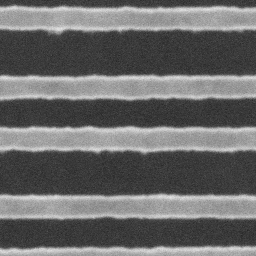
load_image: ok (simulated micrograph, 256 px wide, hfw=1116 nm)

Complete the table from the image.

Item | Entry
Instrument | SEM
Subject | lines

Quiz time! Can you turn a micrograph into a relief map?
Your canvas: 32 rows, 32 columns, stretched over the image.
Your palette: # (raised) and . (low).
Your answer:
................................
################################
################################
################################
................................
................................
................................
................................
................................
................................
################################
################################
................................
................................
................................
................................
################################
################################
################################
................................
................................
................................
................................
................................
#..................###..........
################################
################################
................................
................................
................................
................................
################################